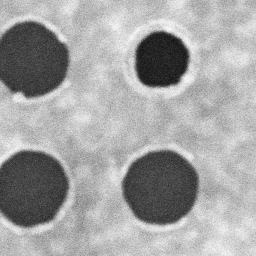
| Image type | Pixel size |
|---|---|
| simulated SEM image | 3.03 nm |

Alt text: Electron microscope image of holes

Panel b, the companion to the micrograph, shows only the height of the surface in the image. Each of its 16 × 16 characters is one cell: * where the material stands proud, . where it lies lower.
****************
*..*************
....*****..*****
....****....****
....*****...****
*...************
****************
****************
****************
*..******..*****
....****....****
....****....****
....****....****
...******...****
****************
****************